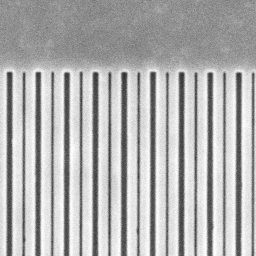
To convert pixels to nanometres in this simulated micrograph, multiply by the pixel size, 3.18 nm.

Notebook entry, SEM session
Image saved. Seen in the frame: parallel lines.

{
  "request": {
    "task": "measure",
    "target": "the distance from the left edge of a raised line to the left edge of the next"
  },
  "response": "45.6 nm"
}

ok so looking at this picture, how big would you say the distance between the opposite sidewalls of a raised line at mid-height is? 0.0318 microns